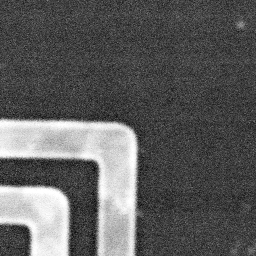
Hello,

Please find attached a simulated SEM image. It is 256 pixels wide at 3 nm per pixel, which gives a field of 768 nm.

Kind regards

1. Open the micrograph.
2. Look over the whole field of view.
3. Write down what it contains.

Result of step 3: groups of lines, slits or small figures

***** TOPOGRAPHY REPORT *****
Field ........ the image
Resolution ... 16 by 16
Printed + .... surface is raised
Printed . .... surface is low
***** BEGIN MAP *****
................
................
................
................
................
................
................
................
++++++++........
++++++++........
......++........
......++........
++++..++........
++++..++........
..++..++........
..++..++........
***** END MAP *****